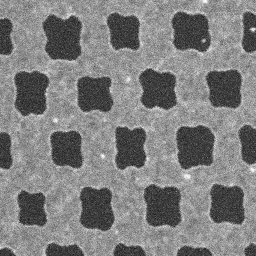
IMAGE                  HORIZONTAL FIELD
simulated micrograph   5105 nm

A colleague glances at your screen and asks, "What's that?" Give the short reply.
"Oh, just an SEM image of a regular array of holes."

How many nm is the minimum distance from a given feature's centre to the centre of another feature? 1280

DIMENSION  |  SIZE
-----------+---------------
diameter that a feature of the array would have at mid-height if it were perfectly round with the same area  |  814 nanometers